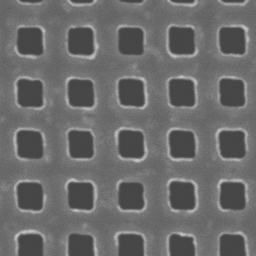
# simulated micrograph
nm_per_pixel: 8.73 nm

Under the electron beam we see a regular array of holes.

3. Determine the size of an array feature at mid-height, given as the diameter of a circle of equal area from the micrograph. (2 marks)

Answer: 259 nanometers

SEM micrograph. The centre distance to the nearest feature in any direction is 440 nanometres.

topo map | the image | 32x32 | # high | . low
################################
################################
################################
###..####..####..####...####..##
##...###....###...###...###....#
##...###....###...###...###....#
##...####...###...###...####...#
################################
################################
################################
##...####...###...###...###....#
##...###....###...###...###....#
##...####...###...###...###....#
################################
################################
################################
##...####..####...###...####..##
##...####...###...###...###....#
##...####...###...###...###....#
##...####...###...####..####..##
################################
################################
################################
##...###....###...###...###....#
##...###....###...###...###....#
##...####...###...###...###....#
################################
################################
################################
##...####..####...###..#####..##
##...###....###...###...###....#
##...###....###...###....##....#